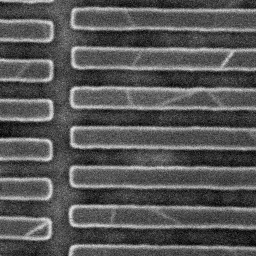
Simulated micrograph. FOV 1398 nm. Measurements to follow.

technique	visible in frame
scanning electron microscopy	wiring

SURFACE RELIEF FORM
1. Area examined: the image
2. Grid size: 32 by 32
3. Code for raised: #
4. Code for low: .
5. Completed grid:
................................
.........#######################
.........#######################
#######..#######################
#######.........................
................................
.........#######################
#........#######################
#######...######################
######..........................
................................
.........#######################
.........#######################
#######..........#######.#######
######..........................
................................
.........#######################
######...#######################
######...............###########
######..........................
................................
.........#######################
######...#######################
######....................######
######..........................
................................
.........#######################
######...#######################
######.......................###
######..........................
................................
.........#######################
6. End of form